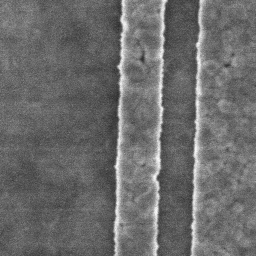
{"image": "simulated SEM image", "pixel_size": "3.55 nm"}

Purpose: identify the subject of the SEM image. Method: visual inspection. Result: one or a few lines or trenches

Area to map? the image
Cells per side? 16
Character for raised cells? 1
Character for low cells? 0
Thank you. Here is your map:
0000000011000111
0000000011001111
0000000011001111
0000000011001111
0000000011001111
0000000011001111
0000000111001111
0000000111001111
0000000111001111
0000000111001111
0000000111001111
0000000111001111
0000000111001111
0000000111001111
0000000011001111
0000000111001111